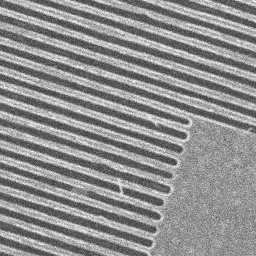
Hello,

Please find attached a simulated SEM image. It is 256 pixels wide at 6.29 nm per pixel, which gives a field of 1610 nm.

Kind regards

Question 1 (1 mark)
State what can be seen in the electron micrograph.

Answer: parallel lines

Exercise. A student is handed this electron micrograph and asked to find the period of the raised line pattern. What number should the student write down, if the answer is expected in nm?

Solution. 88.7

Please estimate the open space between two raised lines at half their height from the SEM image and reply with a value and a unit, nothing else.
47.2 nm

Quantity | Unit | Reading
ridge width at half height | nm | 42